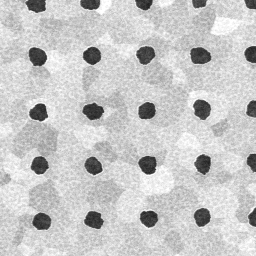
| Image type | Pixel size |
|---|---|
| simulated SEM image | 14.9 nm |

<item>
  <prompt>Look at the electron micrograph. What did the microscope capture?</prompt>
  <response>a regular array of holes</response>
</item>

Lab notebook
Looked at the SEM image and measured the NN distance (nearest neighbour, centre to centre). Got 797 nm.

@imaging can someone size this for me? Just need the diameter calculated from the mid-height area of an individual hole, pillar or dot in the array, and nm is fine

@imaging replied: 280